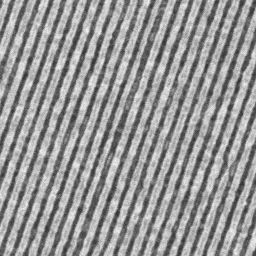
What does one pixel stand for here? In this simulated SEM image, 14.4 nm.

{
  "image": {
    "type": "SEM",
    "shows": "parallel lines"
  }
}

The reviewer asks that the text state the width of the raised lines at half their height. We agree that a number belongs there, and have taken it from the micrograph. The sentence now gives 81.4 nm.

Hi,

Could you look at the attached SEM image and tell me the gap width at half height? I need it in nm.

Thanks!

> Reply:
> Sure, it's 93.3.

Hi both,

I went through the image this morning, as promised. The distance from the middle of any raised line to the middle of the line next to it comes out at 0.173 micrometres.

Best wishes